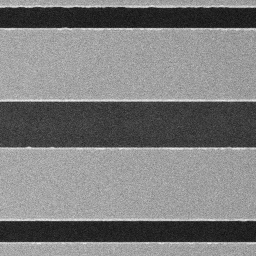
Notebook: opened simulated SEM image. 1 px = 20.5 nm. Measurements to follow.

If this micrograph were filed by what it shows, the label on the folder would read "lines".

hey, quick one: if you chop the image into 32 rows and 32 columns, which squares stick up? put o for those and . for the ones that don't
oooooooooooooooooooooooooooooooo
................................
................................
.......oo.......................
oooooooooooooooooooooooooooooooo
oooooooooooooooooooooooooooooooo
oooooooooooooooooooooooooooooooo
oooooooooooooooooooooooooooooooo
oooooooooooooooooooooooooooooooo
oooooooooooooooooooooooooooooooo
oooooooooooooooooooooooooooooooo
oooooooooooooooooooooooooooooooo
oooooooooooooooooooooooooooooooo
................................
................................
................................
................................
................................
...o............................
oooooooooooooooooooooooooooooooo
oooooooooooooooooooooooooooooooo
oooooooooooooooooooooooooooooooo
oooooooooooooooooooooooooooooooo
oooooooooooooooooooooooooooooooo
oooooooooooooooooooooooooooooooo
oooooooooooooooooooooooooooooooo
oooooooooooooooooooooooooooooooo
oooooooooooooooooooooooooooooooo
................................
................................
oooooooooooooooooooooooooooooooo
oooooooooooooooooooooooooooooooo